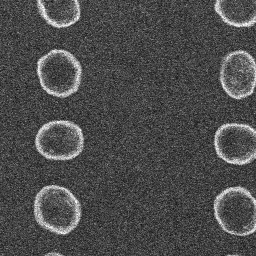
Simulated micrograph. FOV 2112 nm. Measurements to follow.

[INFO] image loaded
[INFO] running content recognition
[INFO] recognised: raised bodies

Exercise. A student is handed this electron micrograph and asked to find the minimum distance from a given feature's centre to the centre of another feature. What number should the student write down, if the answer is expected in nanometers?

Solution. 562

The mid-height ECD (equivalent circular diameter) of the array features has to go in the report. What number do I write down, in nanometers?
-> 347